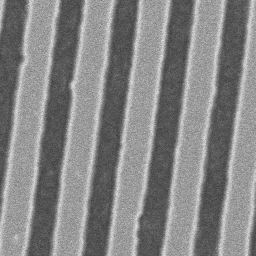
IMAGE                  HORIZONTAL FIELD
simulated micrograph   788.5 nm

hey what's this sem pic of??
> parallel lines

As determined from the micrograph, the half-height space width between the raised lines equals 75.2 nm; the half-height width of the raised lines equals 30.4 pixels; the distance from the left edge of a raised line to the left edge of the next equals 0.17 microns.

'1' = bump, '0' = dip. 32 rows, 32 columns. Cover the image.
10011110001111000111100011110001
00011110001111000111100011110001
00011110001111000111100011110001
00011110001111000111100011110001
00011110001111000111100011110001
00011110001111000111100011110001
00011110001111000111100011100001
00011110001110000111000111100011
00011100011110001111000111100011
00111100011110001111000111100011
00111100011110001111000111100011
00111100011110001111000111100011
00111100011110001111000111100011
00111100011110001111000111000011
00111100011100001110000111000111
00111000011100001110001111000111
01111000111100011110001111000111
01111000111100011110001111000111
01111000111100011110001111000111
01111000111100011110001111000111
01111000111100011110001111000111
01111000111100011110001110000111
01111000111000111100001110000111
11111001111000111100011110001111
11110001111000111100011110001111
11110001111000111100011110001111
11110001111000111100011110001111
11110001111000111000011110001111
11110001111000111000011110001110
11110001110000111000011100001110
11100001110000111000111100011110
11100001110001111000111100011110